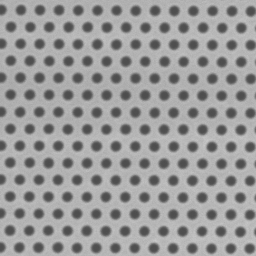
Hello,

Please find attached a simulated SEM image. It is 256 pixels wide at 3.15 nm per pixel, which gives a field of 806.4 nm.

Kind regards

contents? a regular array of holes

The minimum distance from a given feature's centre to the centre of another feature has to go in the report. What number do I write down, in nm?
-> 60.1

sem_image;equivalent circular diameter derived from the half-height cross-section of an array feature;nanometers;31.4